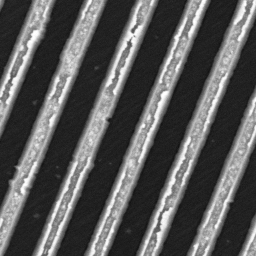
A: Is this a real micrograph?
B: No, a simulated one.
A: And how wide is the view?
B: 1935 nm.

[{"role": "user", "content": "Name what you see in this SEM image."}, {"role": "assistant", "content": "parallel lines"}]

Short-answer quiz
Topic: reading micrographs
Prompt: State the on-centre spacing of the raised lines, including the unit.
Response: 47.8 px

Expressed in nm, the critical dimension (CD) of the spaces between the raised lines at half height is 225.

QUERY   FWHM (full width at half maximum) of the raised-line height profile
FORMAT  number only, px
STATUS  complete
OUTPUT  17.8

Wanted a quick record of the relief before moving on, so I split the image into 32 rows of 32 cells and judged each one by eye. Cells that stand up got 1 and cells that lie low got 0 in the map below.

00001100000110000110000011000011
00001100001110000110000110000011
00011100001100001110000110000111
00011000011100001100001110000110
00011000011000011100001100001110
00110000111000011000011100001100
00110000110000011000011000011100
01110000110000111000011000011100
01100001110000110000111000011000
01100001100001110000110000111000
11000011100001100001110000110000
11000011100001100001100000110000
11000011000011100001100001100001
10000111000011000011100001100001
10000110000111000011000011100001
00001110000110000111000011000011
00001100000110000110000111000011
00001100001100000110000110000011
00011100001100001110000110000110
00011000011100001100001110000110
00111000011000011100001100001110
00110000011000011000011100001100
00110000110000011000011000001100
01100000110000111000011000011000
01100001110000110000111000011000
01100001100001110000110000111000
11000001100001100001110000110000
11000011000001100001100001110000
11000011000011100001100001100001
10000111000011000011100001100001
10000110000111000011000011100001
00001110000110000111000011000011